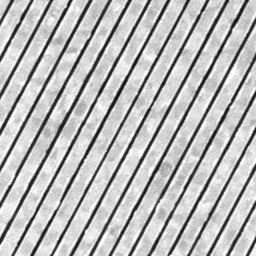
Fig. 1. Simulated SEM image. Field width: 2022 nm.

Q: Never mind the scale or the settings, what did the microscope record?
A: parallel lines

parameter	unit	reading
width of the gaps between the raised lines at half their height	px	4.41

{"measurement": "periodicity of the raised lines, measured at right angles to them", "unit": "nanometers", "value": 136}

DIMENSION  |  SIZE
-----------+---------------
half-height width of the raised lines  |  12.4 px